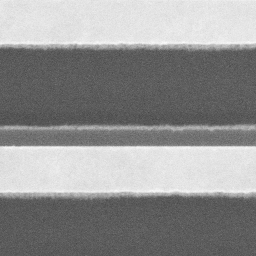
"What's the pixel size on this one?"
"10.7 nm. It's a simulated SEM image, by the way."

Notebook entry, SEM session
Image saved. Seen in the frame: lines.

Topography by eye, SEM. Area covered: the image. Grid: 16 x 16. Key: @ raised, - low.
@@@@@@@@@@@@@@@@
@@@@@@@@@@@@@@@@
@@@@@@@@@@@@@@@@
----------------
----------------
----------------
----------------
----------------
----------------
@@@@@@@@@@@@@@@@
@@@@@@@@@@@@@@@@
@@@@@@@@@@@@@@@@
----------------
----------------
----------------
----------------